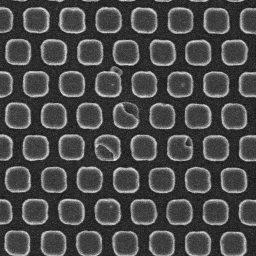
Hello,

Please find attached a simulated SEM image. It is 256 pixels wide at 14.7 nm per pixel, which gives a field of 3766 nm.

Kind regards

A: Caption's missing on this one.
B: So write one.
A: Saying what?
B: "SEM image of a regular array of raised bodies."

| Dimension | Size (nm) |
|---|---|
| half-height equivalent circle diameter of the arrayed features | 393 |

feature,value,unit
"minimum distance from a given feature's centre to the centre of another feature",527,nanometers